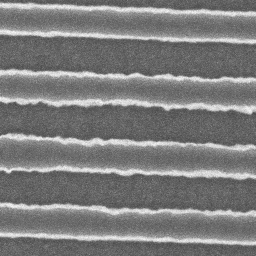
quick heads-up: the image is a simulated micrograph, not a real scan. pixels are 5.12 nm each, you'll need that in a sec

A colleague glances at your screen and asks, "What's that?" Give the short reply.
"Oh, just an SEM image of one or a few lines or trenches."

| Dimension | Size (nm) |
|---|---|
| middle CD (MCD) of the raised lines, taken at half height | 154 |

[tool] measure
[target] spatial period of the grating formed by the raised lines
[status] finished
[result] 0.343 micrometres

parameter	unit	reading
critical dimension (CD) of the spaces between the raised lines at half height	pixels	36.9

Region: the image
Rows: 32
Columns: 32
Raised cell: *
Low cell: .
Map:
................................
**************************......
********************************
********************************
..........*..*******************
................................
................................
................................
................................
***************.**..*...........
********************************
********************************
********************************
..........................******
................................
................................
................................
********........................
********************************
********************************
********************************
.............*.*****************
................................
................................
................................
*...............................
*************************...*...
********************************
********************************
.....***************************
................................
................................